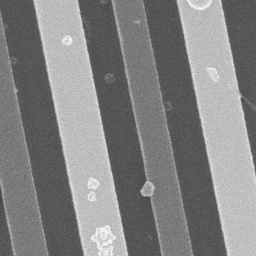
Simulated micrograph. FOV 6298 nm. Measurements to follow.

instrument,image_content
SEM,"lines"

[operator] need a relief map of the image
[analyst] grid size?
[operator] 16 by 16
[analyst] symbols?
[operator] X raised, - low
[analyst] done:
--XXX--XX--XXX--
--XXX--XX--XXX--
---XX--XX---XX--
X--XXX--XX--XX--
X--XXX--XX--XXX-
X--XXX--XX--XXX-
X--XXX--XX--XXX-
X---XX--XX---XX-
XX--XXX--XX--XXX
XX--XXX--XX--XXX
XX--XXX--XX--XXX
XX--XXX--XX--XXX
XX---XX--XX---XX
XXX--XX---XX--XX
-XX--XXX--XX--XX
-XX--XXX--XX--XX